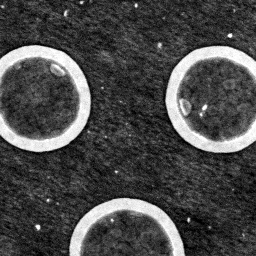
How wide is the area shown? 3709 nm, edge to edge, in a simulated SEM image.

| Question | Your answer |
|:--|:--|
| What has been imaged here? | raised bodies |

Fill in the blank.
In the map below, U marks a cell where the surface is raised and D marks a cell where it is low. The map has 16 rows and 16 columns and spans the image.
DDDDDDDDDDDDDDDD
DDDDDDDDDDDDDDDD
DDDDDDDDDDDDDDDD
DUUUDDDDDDDDUUUD
UUUUUDDDDDDUUUUU
UUUUUDDDDDDUUUUU
UUUUUDDDDDDUUUUU
UUUUUDDDDDDUUUUU
DUUUDDDDDDDDUUUU
DDDDDDDDDDDDDDDD
DDDDDDDDDDDDDDDD
DDDDDDDDDDDDDDDD
DDDDDDDDDDDDDDDD
DDDDDDUUUUDDDDDD
DDDDDUUUUUUDDDDD
DDDDDUUUUUUDDDDD